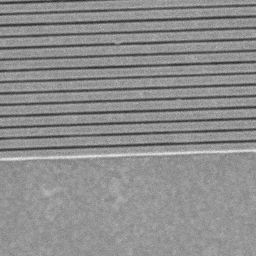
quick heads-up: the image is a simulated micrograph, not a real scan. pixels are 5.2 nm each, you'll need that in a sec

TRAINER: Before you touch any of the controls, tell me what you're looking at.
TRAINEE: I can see parallel lines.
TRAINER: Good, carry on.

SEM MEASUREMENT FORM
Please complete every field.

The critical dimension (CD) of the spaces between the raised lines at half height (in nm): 14.9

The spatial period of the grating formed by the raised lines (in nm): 58.8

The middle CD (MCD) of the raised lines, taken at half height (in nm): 44.8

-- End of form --